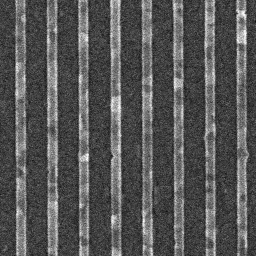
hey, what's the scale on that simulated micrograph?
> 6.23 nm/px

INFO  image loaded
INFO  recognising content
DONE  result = parallel lines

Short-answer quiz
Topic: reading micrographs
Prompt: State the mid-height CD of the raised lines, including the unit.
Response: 53.7 nm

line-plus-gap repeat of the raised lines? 197 nanometres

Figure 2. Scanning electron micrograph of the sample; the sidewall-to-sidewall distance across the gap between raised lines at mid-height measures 143 nanometres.